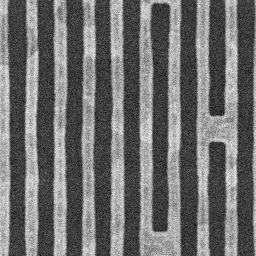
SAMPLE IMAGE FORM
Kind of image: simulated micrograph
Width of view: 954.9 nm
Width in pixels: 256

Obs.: parallel lines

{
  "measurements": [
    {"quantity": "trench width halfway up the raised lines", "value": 0.0764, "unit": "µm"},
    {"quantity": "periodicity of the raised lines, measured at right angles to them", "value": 0.106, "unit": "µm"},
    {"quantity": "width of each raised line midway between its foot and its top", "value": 29.8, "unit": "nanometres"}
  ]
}